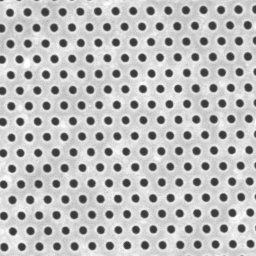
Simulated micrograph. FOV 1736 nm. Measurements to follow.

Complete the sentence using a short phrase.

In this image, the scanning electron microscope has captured a regular array of holes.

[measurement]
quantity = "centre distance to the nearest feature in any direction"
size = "117 nm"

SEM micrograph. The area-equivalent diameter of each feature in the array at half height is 55.7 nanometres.